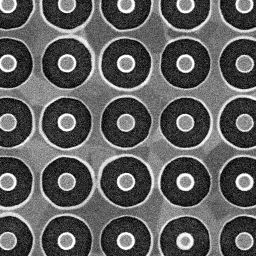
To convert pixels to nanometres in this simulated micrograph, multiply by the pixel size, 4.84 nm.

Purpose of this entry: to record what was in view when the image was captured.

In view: an array of small figures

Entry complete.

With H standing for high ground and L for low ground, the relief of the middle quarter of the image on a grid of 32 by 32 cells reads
HHHLLLLHHLLLLLHHHLLLLLHHLLLLHHHH
HHLLLLLHHLLLLLHHHLLLLLHHLLLLLHHL
LLLLLLLHHLLLLLLLLLLLLHHHLLLLLLLL
LLLLLLHHHHLLLLLLLLLLLHHHHLLLLLLL
LLLLLHHHHHHLLLLLLLLLHHHHHHLLLLLL
LLLLHHHHHHHHHLLLLLLHHHHHHHHLLLLL
HHHHHHHHHHHHHHHHHHHHHHHHHHHHHHHH
HHHHHHHHHHHHHHHHHHHHHHHHHHHHHHHH
LLHHHHHHHHHHHLLLLLHHHHHHHHHHHLLL
LLLLHHHHHHHHLLLLLLLHHHHHHHHLLLLL
LLLLLHHHHHHLLLLLLLLLHHHHHHLLLLLL
LLLLLLHHHHLLLLLLLLLLLHHHHLLLLLLL
LLLLLLLHHHLLLLLLLLLLLLHHLLLLLLLL
HHLLLLLHHLLLLLHHHLLLLLHHLLLLLHHH
HHHLLLLHHLLLLHHHHHLLLLHHLLLLHHHH
HHHLLLLHHLLLLLHHHLLLLLHHLLLLHHHH
LLLLLLLHHLLLLLLHLLLLLHHHLLLLLLHL
LLLLLLHHHHLLLLLLLLLLLHHHHLLLLLLL
LLLLLLHHHHLLLLLLLLLLLHHHHLLLLLLL
LLLLLHHHHHHLLLLLLLLLHHHHHHLLLLLL
LLLHHHHHHHHHHLLLLLHHHHHHHHHHLLLL
HHHHHHHHHHHHHHHHHHHHHHHHHHHHHHHH
HHHHHHHHHHHHHHHHHHHHHHHHHHHHHHHH
LLLHHHHHHHHHHLLLLLHHHHHHHHHHLLLL
LLLLLHHHHHHLLLLLLLLLHHHHHHHLLLLL
LLLLLLHHHHLLLLLLLLLLLHHHHLLLLLLL
LLLLLLLHHLLLLLLLLLLLLLHHHLLLLLLL
LLLLLLLHHLLLLLLLLLLLLLHHLLLLLLLL
HHHLLLLHHLLLLLHHHLLLLLHHLLLLLHHH
HHHLLLLLHLLLLLHHHLLLLLHHLLLLLHHH
HHHLLLLLHLLLLLHHHLLLLLHHLLLLLHHH
LLLLLLLHHLLLLLLLLLLLLLHHLLLLLLLL